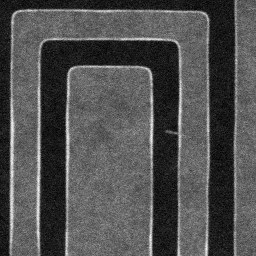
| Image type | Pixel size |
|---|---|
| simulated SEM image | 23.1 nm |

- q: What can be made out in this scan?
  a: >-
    groups of lines, slits or small figures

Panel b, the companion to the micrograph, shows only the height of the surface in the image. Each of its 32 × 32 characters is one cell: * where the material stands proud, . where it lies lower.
.............................***
..**********************.....***
..************************....**
..************************....**
..************************....**
..***.................****....**
.****.................****....**
.****.................****....**
.****....*********....****....**
.****....**********...****....**
.****....**********....***....**
.****....**********....***....**
.****...***********....***....**
.****...***********...****....**
..***...***********...****....**
..***...***********...****...***
..***...***********...****...***
..***...***********...****...***
..***...***********...****...***
..***...***********...****...***
..***...***********...****...***
..***...***********...****...***
..***...***********...****...***
.****...***********...****...***
.****...***********...****...***
..***...***********...****...***
..***...***********...****...***
.****...***********...****...***
.****...***********...****...***
.****...***********...****...***
.****...***********...****...***
.****...***********...****...***